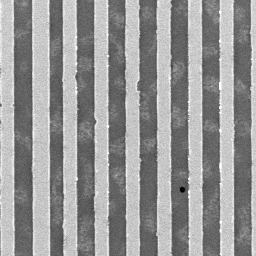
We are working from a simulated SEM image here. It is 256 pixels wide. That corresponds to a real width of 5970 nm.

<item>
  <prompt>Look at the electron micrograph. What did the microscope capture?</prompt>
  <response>parallel lines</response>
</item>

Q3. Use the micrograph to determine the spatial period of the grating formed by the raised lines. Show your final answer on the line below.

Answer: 730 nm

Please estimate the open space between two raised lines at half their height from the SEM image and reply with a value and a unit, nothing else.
426 nm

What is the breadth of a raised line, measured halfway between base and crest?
309 nm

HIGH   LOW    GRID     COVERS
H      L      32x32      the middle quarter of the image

HHHLLLLLHHHLLLLLHHHLLLLHHHHLLLLH
HHHLLLLLHHHLLLLHHHHLLLLHHHHLLLLH
HHHLLLLLHHHLLLLHHHHLLLLHHHHLLLLH
HHHLLLLLHHHLLLLHHHHLLLLHHHHLLLLH
HHHLLLLLHHHLLLLLHHLLLLLHHHHLLLLH
HHHLLLLLHHHLLLLLHHLLLLLHHHHLLLLH
HHHLLLLLHHHLLLLLHHLLLLLHHHHLLLLH
HHHLLLLLHHHLLLLLHHHLLLLHHHHLLLLH
HHHLLLLLHHHLLLLLHHHLLLLHHHHLLLLH
HHHLLLLLHHHLLLLLHHHLLLLHHHHLLLLH
HHHLLLLLHHHLLLLLHHHLLLLHHHHLLLLH
HHHLLLLLHHHLLLLLHHHLLLLHHHHLLLLH
HHHLLLLLHHHLLLLLHHHLLLLHHHHLLLLH
HHHLLLLLHHHLLLLLHHHLLLLHHHHLLLLH
HHHLLLLLHHHLLLLLHHHLLLLHHHHLLLLH
HHHLLLLLHHHLLLLHHHHLLLLHHHHLLLLH
HHHLLLLLHHHLLLLLHHHLLLLHHHHLLLLH
HHHLLLLLHHHLLLLHHHHLLLLHHHHLLLLH
HHHLLLLLHHHLLLLHHHHLLLLLHHHLLLLH
HHHLLLLLHHHLLLLHHHHLLLLLHHHLLLLH
HHHLLLLLHHHLLLLLHHHLLLLLHHLLLLLH
HHHLLLLLHHHLLLLLHHHLLLLHHHHLLLLH
HHHLLLLLHHHLLLLLHHHLLLLHHHHLLLLH
HHHLLLLLHHHLLLLLHHHLLLLHHHHLLLLH
HHHLLLLLHHHLLLLLHHHLLLLHHHHLLLLH
HHHLLLLLHHHLLLLLHHHLLLLLHHHLLLLH
HHHLLLLLHHHLLLLLHHHLLLLLHHHLLLLH
HHHLLLLLHHHLLLLLHHHLLLLLHHHLLLHH
HHHLLLLLHHHLLLLLHHHLLLLLHHHLLLLH
HHHLLLLLHHHLLLLLHHHLLLLLHHHLLLLH
HHHLLLLLHHHLLLLLHHHLLLLLHHHLLLLH
HHHLLLLLHHHLLLLLHHHLLLLLHHHLLLLH